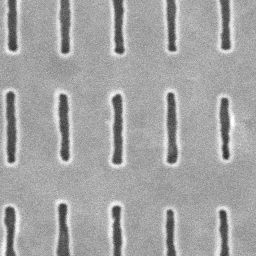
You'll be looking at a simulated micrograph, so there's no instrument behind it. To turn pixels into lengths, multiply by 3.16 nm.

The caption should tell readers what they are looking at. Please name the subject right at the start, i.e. holes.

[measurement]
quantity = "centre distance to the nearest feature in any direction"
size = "169 nanometers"